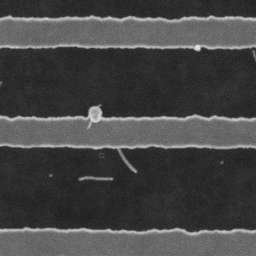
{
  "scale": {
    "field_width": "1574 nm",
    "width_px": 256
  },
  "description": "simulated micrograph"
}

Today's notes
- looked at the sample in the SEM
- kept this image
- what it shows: lines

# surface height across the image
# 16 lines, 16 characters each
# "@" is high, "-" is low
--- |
----------------
@@@@@@@@@@@@@@@@
@@@@@@@@@@@@@@@@
----------------
----------------
----------------
----------------
@@@@@@@@@@@@@@@@
@@@@@@@@@@@@@@@@
----------------
----------------
----------------
----------------
----------------
@@@@@@@@@@@@@@@@
@@@@@@@@@@@@@@@@